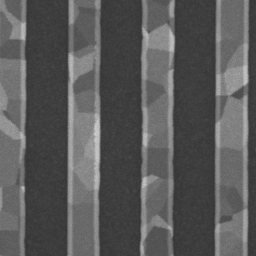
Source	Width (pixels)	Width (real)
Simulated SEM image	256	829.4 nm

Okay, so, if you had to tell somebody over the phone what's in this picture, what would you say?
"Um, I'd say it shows one or a few lines or trenches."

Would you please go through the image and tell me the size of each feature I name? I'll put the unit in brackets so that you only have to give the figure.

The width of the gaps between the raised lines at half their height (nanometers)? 149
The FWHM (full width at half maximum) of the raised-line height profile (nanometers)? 90.8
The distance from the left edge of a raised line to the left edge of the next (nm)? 240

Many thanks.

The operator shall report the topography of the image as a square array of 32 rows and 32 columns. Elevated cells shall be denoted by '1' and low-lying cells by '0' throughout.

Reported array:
11100000011100000011110000011110
11100000011100000011100000011110
11100000011100000011110000011110
11100000011100000011110000011110
11100000011100000011110000011110
11100000011100000011110000011110
11100000011100000011100000011110
11100000011100000011100000011110
11100000011100000011100000011110
11100000011100000011100000011110
11100000011100000011100000011110
11100000011100000011100000011110
11100000011100000011100000011110
11100000011100000011100000011110
11100000011100000011100000011110
11100000011100000011100000011110
11100000011100000011100000011110
11100000011100000011100000011110
11100000011100000011100000011110
11100000011100000011100000011110
11100000011100000011100000011110
11100000011100000011100000011110
11100000011100000011100000011110
11100000011100000011100000011110
11100000011100000011100000011110
11100000011100000011100000011110
11100000011100000011100000011110
11100000011100000011100000011110
11100000011100000011100000011110
11100000011100000011100000011110
11100000011100000011100000011110
11100000011100000011100000011110